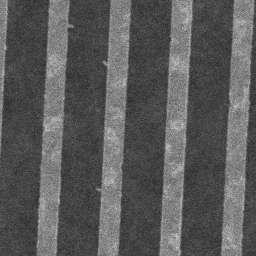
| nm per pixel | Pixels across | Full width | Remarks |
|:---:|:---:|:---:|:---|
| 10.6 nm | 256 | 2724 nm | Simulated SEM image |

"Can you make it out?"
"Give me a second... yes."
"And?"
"parallel lines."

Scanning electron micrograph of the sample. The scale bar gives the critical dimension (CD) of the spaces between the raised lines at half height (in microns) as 0.457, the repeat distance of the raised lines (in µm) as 0.654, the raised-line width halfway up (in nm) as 200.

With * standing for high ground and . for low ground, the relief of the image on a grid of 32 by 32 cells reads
*.....***.....**......**.....***
*.....**......**......**.....***
*.....**......**......**.....***
*.....***.....**.....***.....**.
*.....**......**.....***.....**.
*.....**......**.....***.....**.
*.....**......**.....***.....**.
......**......**.....***.....**.
......**.....***.....**......**.
......**.....***.....**......**.
......**.....***.....**......**.
......**.....***.....**......**.
......**.....***.....**......**.
......**.....***.....**......**.
......**.....***.....**......**.
......**.....***.....**......**.
.....***.....**......**......**.
.....***.....**......**.....***.
.....***.....**......**.....***.
.....***.....**......**.....***.
.....***.....**......**.....***.
.....**......**......**.....***.
.....**......**......**.....***.
.....**......**.....***.....**..
.....**......**.....***.....**..
.....**......**.....***.....**..
.....**......**.....***.....**..
.....**......**.....***.....**..
.....**.....***.....**......**..
.....**.....***.....**......**..
.....**.....***.....**......**..
.....**.....***.....***.....**..